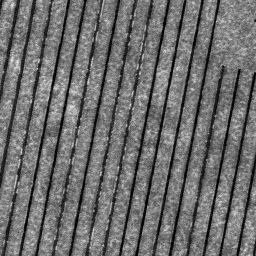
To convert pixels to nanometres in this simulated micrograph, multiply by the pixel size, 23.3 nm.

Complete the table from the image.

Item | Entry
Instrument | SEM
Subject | parallel lines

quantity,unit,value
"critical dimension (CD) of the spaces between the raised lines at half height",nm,65.7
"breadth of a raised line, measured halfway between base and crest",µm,0.309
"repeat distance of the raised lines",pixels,16.4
